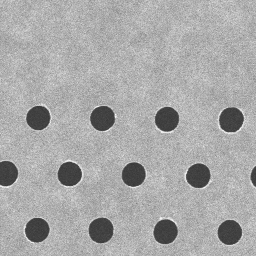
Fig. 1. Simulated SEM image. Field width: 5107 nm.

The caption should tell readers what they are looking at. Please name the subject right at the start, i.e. a regular array of holes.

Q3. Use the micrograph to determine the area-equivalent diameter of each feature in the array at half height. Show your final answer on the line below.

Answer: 490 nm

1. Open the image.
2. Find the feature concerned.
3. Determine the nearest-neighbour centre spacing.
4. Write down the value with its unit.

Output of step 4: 1.28 microns